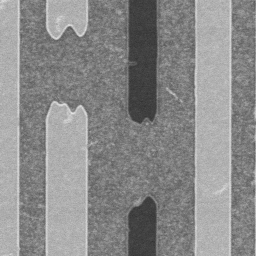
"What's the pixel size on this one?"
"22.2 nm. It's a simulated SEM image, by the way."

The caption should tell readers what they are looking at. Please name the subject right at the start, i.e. one or a few lines or trenches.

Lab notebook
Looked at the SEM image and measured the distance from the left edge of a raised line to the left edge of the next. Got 1600 nm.